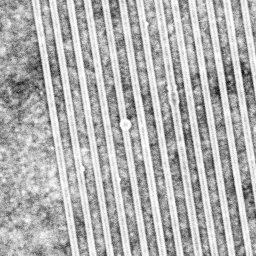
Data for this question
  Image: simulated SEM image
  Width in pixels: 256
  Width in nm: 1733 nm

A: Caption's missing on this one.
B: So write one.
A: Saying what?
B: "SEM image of parallel lines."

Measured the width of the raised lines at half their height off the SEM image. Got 40.1 nanometers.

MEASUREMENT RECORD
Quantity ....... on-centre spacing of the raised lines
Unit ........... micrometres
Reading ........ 0.116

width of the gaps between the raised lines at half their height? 79.4 nanometers